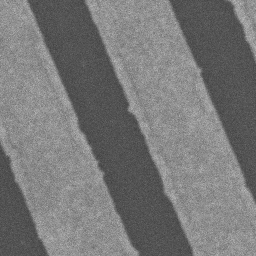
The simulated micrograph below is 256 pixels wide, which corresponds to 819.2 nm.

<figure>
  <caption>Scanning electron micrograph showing one or a few lines or trenches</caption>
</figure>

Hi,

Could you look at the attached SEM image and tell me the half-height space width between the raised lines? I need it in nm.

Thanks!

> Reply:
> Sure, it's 182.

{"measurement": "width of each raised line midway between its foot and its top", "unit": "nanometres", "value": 238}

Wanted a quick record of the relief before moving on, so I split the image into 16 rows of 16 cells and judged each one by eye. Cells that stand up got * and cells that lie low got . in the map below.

**....*****....*
**....*****....*
***...*****.....
***....*****....
****...*****....
****....*****...
****....*****...
*****....*****..
*****....*****..
******...*****..
.*****....*****.
.*****....*****.
..*****....*****
..*****....*****
..******....****
...*****....****